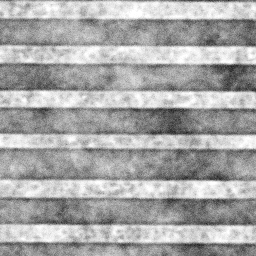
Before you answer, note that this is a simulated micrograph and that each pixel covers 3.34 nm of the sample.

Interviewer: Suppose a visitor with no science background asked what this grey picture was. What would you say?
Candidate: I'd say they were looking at parallel lines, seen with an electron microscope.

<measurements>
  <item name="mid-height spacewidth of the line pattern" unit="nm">95.2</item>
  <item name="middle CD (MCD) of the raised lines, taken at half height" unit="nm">55.1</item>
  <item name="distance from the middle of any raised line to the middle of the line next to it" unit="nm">150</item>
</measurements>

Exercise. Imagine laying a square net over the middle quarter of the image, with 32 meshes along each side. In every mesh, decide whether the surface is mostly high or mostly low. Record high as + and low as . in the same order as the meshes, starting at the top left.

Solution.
................................
................................
................................
................................
................................
................................
................................
++++++++++++++++++++++++++++++++
++++++++++++++++++++++++++++++++
+++++++++++++++++++++++++++++..+
++++++++++++++++++++++++++++++++
................................
................................
................................
................................
................................
................................
................................
++++++++++++++++++++++++++++++++
++++++++++++++++++++++++++++++++
++++++++++++++++++++++++++++++++
................................
................................
................................
................................
................................
................................
................................
................................
++++++++++++++++++++++++++++++++
++++++++.+++++++++++++++++++++++
++++++++++++++++++++++++++++++++